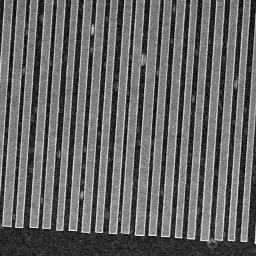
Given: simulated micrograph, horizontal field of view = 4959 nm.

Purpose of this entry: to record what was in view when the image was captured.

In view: parallel lines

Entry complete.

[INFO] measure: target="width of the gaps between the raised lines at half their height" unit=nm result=109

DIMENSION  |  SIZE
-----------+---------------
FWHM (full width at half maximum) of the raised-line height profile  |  155 nm